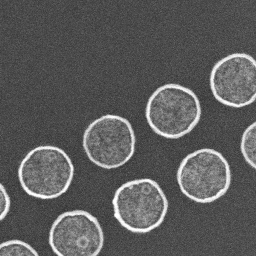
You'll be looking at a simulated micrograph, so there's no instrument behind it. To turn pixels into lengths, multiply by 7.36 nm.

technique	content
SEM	raised bodies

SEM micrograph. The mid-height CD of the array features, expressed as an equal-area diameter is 377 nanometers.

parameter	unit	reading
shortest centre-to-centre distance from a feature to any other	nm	519